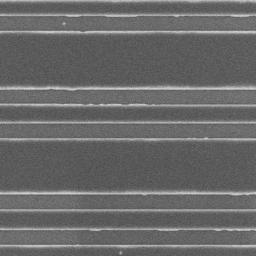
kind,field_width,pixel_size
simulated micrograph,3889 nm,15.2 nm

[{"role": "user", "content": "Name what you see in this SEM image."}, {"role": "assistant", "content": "lines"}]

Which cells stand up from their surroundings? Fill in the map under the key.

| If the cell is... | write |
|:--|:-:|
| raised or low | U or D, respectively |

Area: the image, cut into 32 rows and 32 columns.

UUUUUUUUUUUUUUUUUUUUUUUUUUUUUUUU
UUUUUUUUUUUUUUUUUUUUUUUUUUUUUUUU
DDDDDDDDDDDDDDDDDDDDDDDDDDDDDDDD
DDDDDDDDDDDDDDDDDDDDDDDDDDDDDDDD
UUUUUUUUUUUUUUUUUUUUUUUUUUUUUUUU
UUUUUUUUUUUUUUUUUUUUUUUUUUUUUUUU
UUUUUUUUUUUUUUUUUUUUUUUUUUUUUUUU
UUUUUUUUUUUUUUUUUUUUUUUUUUUUUUUU
UUUUUUUUUUUUUUUUUUUUUUUUUUUUUUUU
UUUUUUUUUUUUUUUUUUUUUUUUUUUUUUUU
UUUUUUUUUUUUUUUUUUUUUUUUUUUUUUUU
DDDDDDDDDDDDDDDDDDDDDDDDDDDDDDDD
DDDDDDDDDDDDDDDDDDDDDDDDDDDDDDDD
UUUUUUUUUUUUUUUUUUUUUUUUUUUUUUUU
UUUUUUUUUUUUUUUUUUUUUUUUUUUUUUUU
DDDDDDDDDDDDDDDDDDDDDDDDDDDDDDDD
DDDDDDDDDDDDDDDDDDDDDDDDDDDDDDDD
UUUUUUUUUUUUUUUUUUUUUUUUUUUUUUUU
UUUUUUUUUUUUUUUUUUUUUUUUUUUUUUUU
UUUUUUUUUUUUUUUUUUUUUUUUUUUUUUUU
UUUUUUUUUUUUUUUUUUUUUUUUUUUUUUUU
UUUUUUUUUUUUUUUUUUUUUUUUUUUUUUUU
UUUUUUUUUUUUUUUUUUUUUUUUUUUUUUUU
UUUUUUUUUUUUUUUUUUUUUUUUUUUUUUUU
DDDDDDDDDDDDDDDDDDDDDDDDDDDDDDDD
DDDDDDDDDDDDDDDDDDDDDDDDDDDDDDDD
UUUUUUUUUUUUUUUUUUUUUUUUUUUUUUUU
UUUUUUUUUUUUUUUUUUUUUUUUUUUUUUUU
UUUUUUUUUUUUUUUUUUUUUUUUUUUUUUUU
DDDDDDDDDDDDDDDDDDDDDDDDDDDDDDDD
DDDDDDDDDDDDDDDDDDDDDDDDDDDDDDDD
UUUUUUUUUUUUUUUUUUUUUUUUUUUUUUUU